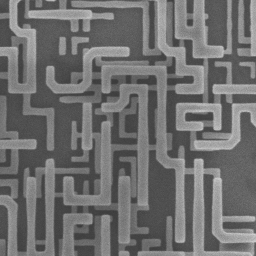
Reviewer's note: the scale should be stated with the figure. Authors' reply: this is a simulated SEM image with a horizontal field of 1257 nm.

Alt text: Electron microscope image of wiring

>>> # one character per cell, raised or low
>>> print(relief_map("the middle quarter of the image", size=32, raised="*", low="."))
.....**....**...............***.
.....**...****************..****
.....**...******....******..****
.....**...**...........***......
....***...**...........***......
******....**..*******..***..****
*****.....**..*******..***..****
..............***.***..***...***
..............**...**..***......
.............***...**..***......
.....**...*****....**...*...****
.....**...****.....**...*...****
.....**............**...*...**..
.....**............**..**...**..
.....**...*........**..**...***.
.....**..***.......**..***..****
.....**..***.......**..***..****
.....**..***.......**..***......
.....**..***.......**..***......
.....**..***.......**..***......
.....**..***.......**..***......
.........***.......**..***......
.........***.......**..***......
.........***.......**..***......
.........***.......**...******..
.........***.......**....*****..
.........***.......**.......**..
.........***.......**.......**..
**.......***..***..**.......**..
**.......***..***..**.......**..
**.......***..***..**.......**..
**.......***..***..**.......**..